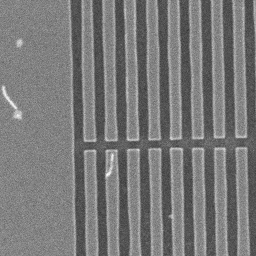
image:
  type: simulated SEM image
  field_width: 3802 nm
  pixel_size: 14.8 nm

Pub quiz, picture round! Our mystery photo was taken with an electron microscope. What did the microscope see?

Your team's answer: groups of lines, slits or small figures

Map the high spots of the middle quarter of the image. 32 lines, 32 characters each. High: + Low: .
++...++...+++...++...+++..+++...
++...++...+++...++...+++..+++...
++...++...+++...++...+++..+++...
++...++...+++...++...+++..+++...
++...++...+++...++...+++..+++...
++...++...+++...++...+++...++...
++...++...+++...++...+++...++...
++...+++..+++...++...+++...++...
++...+++..+++...++...+++...++...
++...+++..+++...++...+++...++...
++...+++..+++...++...+++...++...
++...+++..+++...++...+++...++...
++...+++...++...++...+++...++...
++...+++...++...++...+++...++...
++...+++..+++...+++..+++...++...
++...+++..+++...+++..+++...++...
++...+++..+++...+++..+++...++...
++...+++..+++...+++..+++...++...
++...+++..+++...+++..+++...++...
++..............................
++..............................
++..............+++..+++...+++..
++...+++...++...+++..+++...+++..
++...+++...++...+++..+++...+++..
+++..+++...++...+++...++...+++..
+++..+++...++...+++...++...+++..
+++..+++...++...+++...++...+++..
+++..+++...++...+++...++...+++..
+++..+++...++...+++...++...+++..
+++..+++...++...+++...++...+++..
+++..+++...++...+++...++...+++..
+++..+++...++...+++...++...+++..